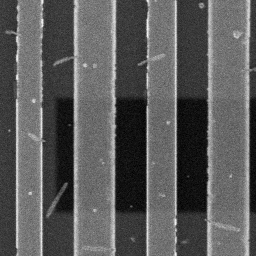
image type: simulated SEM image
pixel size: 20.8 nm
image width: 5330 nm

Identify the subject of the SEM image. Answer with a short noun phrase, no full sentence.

lines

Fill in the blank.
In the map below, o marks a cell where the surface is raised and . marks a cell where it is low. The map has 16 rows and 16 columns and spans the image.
.oo..oo..oo..ooo
.oo..oo..oo..ooo
.oo..oo..oo..ooo
.oo..oo..oo..ooo
.oo..oo..oo..ooo
.oo..oo..oo..ooo
.oo..oo..oo..oo.
.oo..oo..oo..oo.
.oo..oo..oo..oo.
.oo..oo..oo..oo.
.oo..oo..oo..oo.
.oo..oo..oo..oo.
.oo..oo..oo..oo.
.oo..oo..oo..oo.
.oo..oo..oo..oo.
.oo..oo..oo..oo.